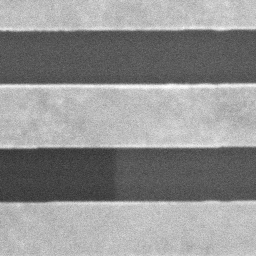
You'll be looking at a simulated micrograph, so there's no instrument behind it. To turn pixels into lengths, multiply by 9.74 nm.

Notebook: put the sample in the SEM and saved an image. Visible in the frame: lines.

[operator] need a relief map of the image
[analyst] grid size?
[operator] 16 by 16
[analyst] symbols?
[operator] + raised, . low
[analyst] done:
++++++++++++++++
++++++++++++++++
................
................
................
++++++++++++++++
++++++++++++++++
++++++++++++++++
++++++++++++++++
................
................
................
................
++++++++++++++++
++++++++++++++++
++++++++++++++++